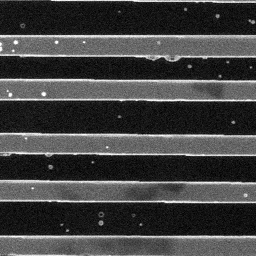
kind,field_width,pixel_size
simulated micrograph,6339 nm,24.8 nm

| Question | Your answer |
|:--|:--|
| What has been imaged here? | lines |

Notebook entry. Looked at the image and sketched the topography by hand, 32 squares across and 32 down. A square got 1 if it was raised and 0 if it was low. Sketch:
00000000000000000000000000000000
00000000000000000000000000000000
00000000000000000000000000000000
00000000000000000000000000000000
11111111111111111111111111111111
11111111111111111111111111111111
11111111111111111111111111111111
00000000000000000000010000000000
00000000000000000000000000000000
00000000000000000000000000000000
11111111111111111111111111111111
11111111111111111111111111111111
00000000000000000011111111111111
00000000000000000000000000000000
00000000000000000000000000000000
00000000000000000000000000000000
00000000000000000000000000000000
11111111111111111111111111111111
11111111111111111111111111111111
00000000000000000000000000000000
00000000000000000000000000000000
00000000000000000000000000000000
00000000000000000000000000000000
11111111111111111111111111111111
11111111111111111111111111111111
00000000000000000000000000000000
00000000000000000000000000000000
00000000000000000000000000000000
00000000000000000000000000000000
00000000000000000000000000000000
11111111111111111111111111111111
11111111111111111111111111111111